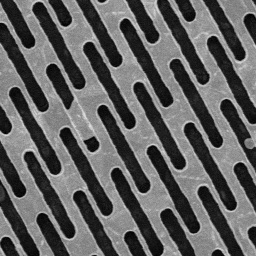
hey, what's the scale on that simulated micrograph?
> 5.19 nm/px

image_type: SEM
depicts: a regular array of holes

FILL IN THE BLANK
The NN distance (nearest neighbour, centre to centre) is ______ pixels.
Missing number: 43.2